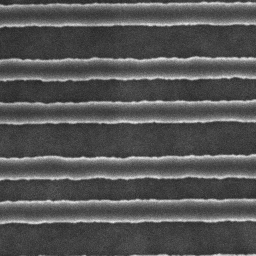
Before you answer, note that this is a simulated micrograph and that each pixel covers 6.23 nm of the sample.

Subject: lines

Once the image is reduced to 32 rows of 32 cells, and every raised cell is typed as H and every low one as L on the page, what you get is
LLLLLLLLLLLHHLLLLHHHHHHHHHHHHHHH
HHHHHHHHHHHHHHHHHHHHHHHHHHHHHHHH
HHHHHHHHHHHHHHHHHHHHHHHHHHHHHHHH
LLLLLLLLLLLLLLLLLLLLLLLLLLLLLLLL
LLLLLLLLLLLLLLLLLLLLLLLLLLLLLLLL
LLLLLLLLLLLLLLLLLLLLLLLLLLLLLLLL
LLLLLLLLLLLLLLLLLLLLLLLLLLLLLLLL
HHHHHLHHHHHHHHHHHHHHHHHHHHHHHHHH
HHHHHHHHHHHHHHHHHHHHHHHHHHHHHHHH
HHHHHHHHHHHHHHHHHHHHHHHHHHHHHHHH
LLLLLLLLLLLLLLLLLLLLLLLLLLLLLLLL
LLLLLLLLLLLLLLLLLLLLLLLLLLLLLLLL
LLLLLLLLLLLLLLLLLLLLLLLLLLLLLLLL
HHHHHHHHHHHHHHHHHHHHHHHHHHHHHHHH
HHHHHHHHHHHHHHHHHHHHHHHHHHHHHHHH
LLLLLLLLLLLLLLLLLLLLLLLLLLLLLLLL
LLLLLLLLLLLLLLLLLLLLLLLLLLLLLLLL
LLLLLLLLLLLLLLLLLLLLLLLLLLLLLLLL
LLLLLLLLLLLLLLLLLLLLLLLLLLLLLLLL
LLLLLLLLLLLLLLLLLLLLLLLLLHHHHHHH
HHHHHHHHHHHHHHHHHHHHHHHHHHHHHHHH
HHHHHHHHHHHHHHHHHHHHHHHHHHHHHHHH
LLLLLLLLLLLLLLLLLLLLLLLLLLLLLLLL
LLLLLLLLLLLLLLLLLLLLLLLLLLLLLLLL
LLLLLLLLLLLLLLLLLLLLLLLLLLLLLLLL
HHHHHHHHHHHHHHHHHHHHHHHHHHHHHHHH
HHHHHHHHHHHHHHHHHHHHHHHHHHHHHHHH
HHHHHHHHHHHHHHHHHHHHHHHHHHHHHHHH
LLLLLLLLLLLLLLLLLLLLLLLLLLLLLLLL
LLLLLLLLLLLLLLLLLLLLLLLLLLLLLLLL
LLLLLLLLLLLLLLLLLLLLLLLLLLLLLLLL
LLLLLLLLLLLLLLLLLLLLLLLLLLLLLLLL